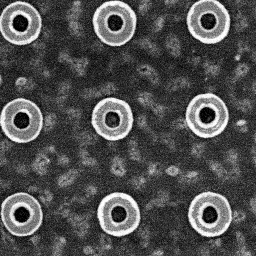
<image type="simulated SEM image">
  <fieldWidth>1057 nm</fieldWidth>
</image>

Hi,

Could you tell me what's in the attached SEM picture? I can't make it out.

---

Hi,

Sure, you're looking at ring-shaped raised bodies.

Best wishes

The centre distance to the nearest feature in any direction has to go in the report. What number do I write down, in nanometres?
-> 380